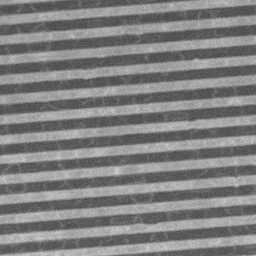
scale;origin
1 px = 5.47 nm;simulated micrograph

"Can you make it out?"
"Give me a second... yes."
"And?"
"parallel lines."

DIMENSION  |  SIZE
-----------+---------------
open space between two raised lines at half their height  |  63.4 nm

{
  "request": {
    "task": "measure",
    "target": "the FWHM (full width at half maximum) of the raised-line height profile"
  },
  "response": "43.6 nm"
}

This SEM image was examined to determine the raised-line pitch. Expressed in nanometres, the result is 109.